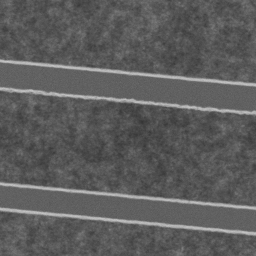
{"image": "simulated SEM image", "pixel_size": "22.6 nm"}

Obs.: one or a few lines or trenches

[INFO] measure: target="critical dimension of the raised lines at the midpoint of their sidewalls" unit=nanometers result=587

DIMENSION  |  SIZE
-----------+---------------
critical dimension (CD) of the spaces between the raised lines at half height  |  2140 nanometers